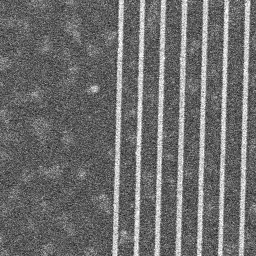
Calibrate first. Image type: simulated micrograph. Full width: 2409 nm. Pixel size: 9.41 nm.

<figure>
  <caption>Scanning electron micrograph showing parallel lines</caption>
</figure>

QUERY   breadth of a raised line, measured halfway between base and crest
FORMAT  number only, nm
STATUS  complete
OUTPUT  34.1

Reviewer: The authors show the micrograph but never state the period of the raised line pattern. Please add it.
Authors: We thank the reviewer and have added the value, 198 nanometres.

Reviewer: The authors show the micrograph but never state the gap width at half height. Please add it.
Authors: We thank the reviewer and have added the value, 0.162 um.